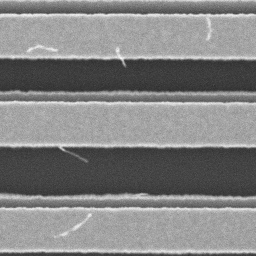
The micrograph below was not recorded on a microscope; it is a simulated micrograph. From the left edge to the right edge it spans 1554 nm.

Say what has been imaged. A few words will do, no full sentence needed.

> lines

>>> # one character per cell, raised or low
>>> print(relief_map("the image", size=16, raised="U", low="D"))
UUUUUUUUUUUUUUUU
UUUUUUUUUUUUUUUU
UUUUUUUUUUUUUUUU
UUUUUUUUUUUUUUUU
DDDDDDDDDDDDDDDD
DDDDDDDDDDDDDDDD
UUUUUUUUUUUUUUUU
UUUUUUUUUUUUUUUU
UUUUUUUUUUUUUUUU
DDDDDDDDDDDDDDDD
DDDDDDDDDDDDDDDD
DDDDDDDDDDDDDDDD
UUUUUUUUUUUUUUUU
UUUUUUUUUUUUUUUU
UUUUUUUUUUUUUUUU
UUUUUUUUUUUUUUUU